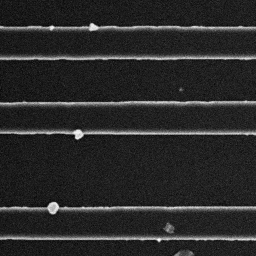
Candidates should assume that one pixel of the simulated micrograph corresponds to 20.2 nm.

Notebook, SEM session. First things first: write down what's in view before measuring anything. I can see lines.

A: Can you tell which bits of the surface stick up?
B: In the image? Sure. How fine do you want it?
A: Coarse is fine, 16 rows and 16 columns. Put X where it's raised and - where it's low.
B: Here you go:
----------------
----------------
XXXXXXXXXXXXXXXX
XXXXXXXXXXXXXXXX
----------------
----------------
XXXXXXXXXXXXXXXX
XXXXXXXXXXXXXXXX
----------------
----------------
----------------
----------------
----------------
XXXXXXXXXXXXXXXX
XXXXXXXXXXXXXXXX
----------------